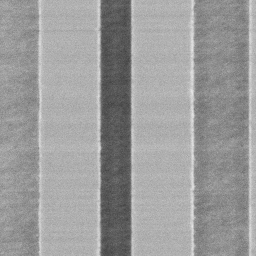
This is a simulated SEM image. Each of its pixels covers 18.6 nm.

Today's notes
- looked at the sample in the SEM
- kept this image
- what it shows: lines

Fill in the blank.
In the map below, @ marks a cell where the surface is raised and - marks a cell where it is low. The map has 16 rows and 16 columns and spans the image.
--@@@@--@@@@----
--@@@@--@@@@----
--@@@@--@@@@----
--@@@@--@@@@----
--@@@@--@@@@----
--@@@@--@@@@----
--@@@@--@@@@----
--@@@@--@@@@----
--@@@@--@@@@----
--@@@@--@@@@----
--@@@@--@@@@----
--@@@@--@@@@----
--@@@@--@@@@----
--@@@@--@@@@----
--@@@@--@@@@----
--@@@@--@@@@----